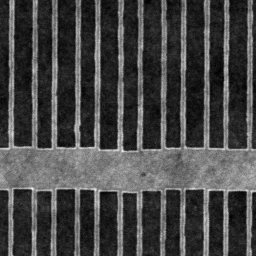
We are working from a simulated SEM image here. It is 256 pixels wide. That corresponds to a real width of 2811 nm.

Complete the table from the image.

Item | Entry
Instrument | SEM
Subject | parallel lines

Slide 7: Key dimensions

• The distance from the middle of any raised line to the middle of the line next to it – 238 nanometres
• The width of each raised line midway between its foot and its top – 42.5 nm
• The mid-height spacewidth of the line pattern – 214 nanometres